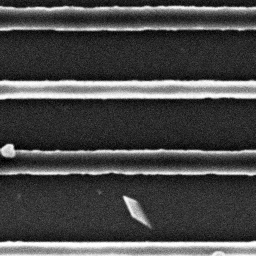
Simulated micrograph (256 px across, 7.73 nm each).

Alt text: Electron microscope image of lines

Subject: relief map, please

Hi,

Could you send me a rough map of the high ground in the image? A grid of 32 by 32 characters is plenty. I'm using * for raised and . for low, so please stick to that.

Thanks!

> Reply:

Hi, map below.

................................
********************************
********************************
********************************
................................
................................
................................
................................
................................
................................
********************************
********************************
................................
................................
................................
................................
................................
................................
**..............................
********************************
********************************
********************************
................................
................................
................................
................................
................................
................................
................................
................................
*********.*.********************
********************************